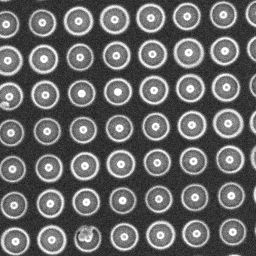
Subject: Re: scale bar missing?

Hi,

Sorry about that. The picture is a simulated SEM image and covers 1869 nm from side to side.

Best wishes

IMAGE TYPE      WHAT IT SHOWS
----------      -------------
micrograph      an array of small figures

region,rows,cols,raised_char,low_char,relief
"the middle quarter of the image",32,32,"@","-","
@@----@@@@@----@@@@@@--@@@@@@@@-
@@@@@@@@@@@@@@@@@@@@@@@@@@@@@@@@
@@@@@@@@@@@@@@@@@@@@@@@@@@@@@@@@
@@@@@@@@@@@@@@@@@@@@@@-@@@@@@@--
@@@@-@@@@@@@---@@@@@-----@@@@---
@@-----@@@@-----@@@-------@@----
@@-----@@@---@---@@---@---@@---@
@---@---@@---@---@@@------@@@---
@@-----@@@@-----@@@@-----@@@@@--
@@-----@@@@@---@@@@@@---@@@@@@@@
@@@@@@@@@@@@@@@@@@@@@@@@@@@@@@@@
@@@@@@@@@@@@@@@@@@@@@@@@@@@@@@@@
@@@@@@@@@@@@@@@@@@@@@@-@@@@@@@@-
@@@@-@@@@@@@---@@@@@@----@@@@---
@@@----@@@@-----@@@@------@@@---
@@------@@@--@---@@@--@@--@@@--@
@@--@@--@@@--@@--@@@------@@@---
@@------@@@------@@@@----@@@@@--
@@@----@@@@@----@@@@@@--@@@@@@@@
@@@@-@@@@@@@@@@@@@@@@@@@@@@@@@@@
@@@@@@@@@@@@@@@@@@@@@@@@@@@@@@@@
@@@@@@@@@@@@@@@@@@@@@@@@@@@@@@@-
@@@@--@@@@@@----@@@@@----@@@@@--
@@@-----@@@------@@@------@@@---
@@------@@@------@@@---@--@@@---
@@---@--@@@---@--@@@@-----@@@@--
@@------@@@@-----@@@@-----@@@@--
@@@-----@@@@----@@@@@@@-@@@@@@@@
@@@@--@@@@@@@@@@@@@@@@@@@@@@@@@@
@@@@@@@@@@@@@@@@@@@@@@@@@@@@@@@@
@@@@@@@@@@@@@@@@@@@@@@@@@@@@@@@@
@@@@@-@@@@@@@---@@@@@@----@@@@--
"